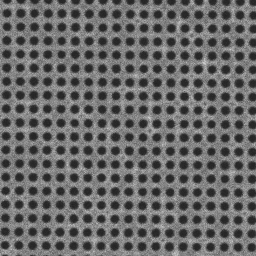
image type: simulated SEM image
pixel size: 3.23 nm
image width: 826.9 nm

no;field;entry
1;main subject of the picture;a regular array of holes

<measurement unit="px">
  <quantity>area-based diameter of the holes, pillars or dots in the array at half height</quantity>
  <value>8.51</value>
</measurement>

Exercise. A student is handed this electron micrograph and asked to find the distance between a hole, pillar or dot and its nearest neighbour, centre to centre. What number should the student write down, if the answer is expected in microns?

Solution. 0.0434